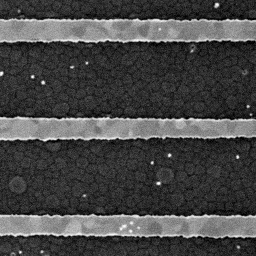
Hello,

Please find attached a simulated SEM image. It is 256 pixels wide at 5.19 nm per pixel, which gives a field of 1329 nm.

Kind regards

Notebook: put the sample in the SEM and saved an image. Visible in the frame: lines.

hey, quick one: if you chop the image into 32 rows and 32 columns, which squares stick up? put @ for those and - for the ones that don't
--------------------------------
--------------------------------
@@@@@@@@@-@@@@@@@@@@-@--@@--@@@-
@@@@@@@@@@@@@@@@@@@@@@@@@@@@@@@@
@@@@@@@@@@@@@@@@@@@@@@@@@@@@@@@@
--------------------------------
--------------------------------
--------------------------------
--------------------------------
--------------------------------
--------------------------------
--------------------------------
--------------------------------
--------------------------------
--------------------------------
@@@@@@@@@@@@@@@@@@@@@@@@@@@@@@@@
@@@@@@@@@@@@@@@@@@@@@@@@@@@@@@@@
-----@--------------------------
--------------------------------
--------------------------------
--------------------------------
--------------------------------
--------------------------------
--------------------------------
--------------------------------
--------------------------------
--------------------------------
@@@@@@@@@@@@@@@@@@@@@@@@@@@@@@@@
@@@@@@@@@@@@@@@@@@@@@@@@@@@@@@@@
------------------@-@--@-@@@@@@@
--------------------------------
--------------------------------